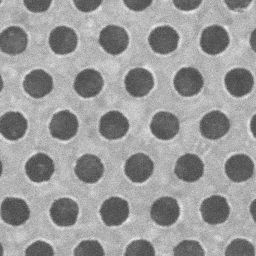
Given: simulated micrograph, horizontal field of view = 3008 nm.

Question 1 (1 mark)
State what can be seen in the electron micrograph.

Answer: a regular array of holes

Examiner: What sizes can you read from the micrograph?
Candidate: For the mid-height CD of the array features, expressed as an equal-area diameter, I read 370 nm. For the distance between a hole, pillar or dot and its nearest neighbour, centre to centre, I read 577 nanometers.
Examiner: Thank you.